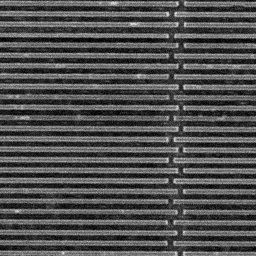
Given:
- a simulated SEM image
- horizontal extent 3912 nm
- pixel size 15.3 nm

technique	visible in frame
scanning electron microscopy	parallel lines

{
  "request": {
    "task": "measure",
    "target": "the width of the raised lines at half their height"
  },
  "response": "66.8 nm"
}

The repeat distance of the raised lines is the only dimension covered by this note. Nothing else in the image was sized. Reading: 159 nanometers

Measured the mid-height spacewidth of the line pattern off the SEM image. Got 93.6 nanometers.